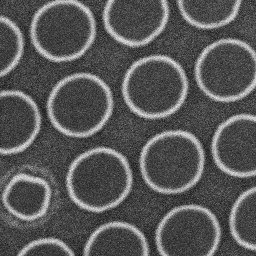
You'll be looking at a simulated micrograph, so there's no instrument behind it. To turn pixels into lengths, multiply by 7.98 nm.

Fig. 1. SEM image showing raised bodies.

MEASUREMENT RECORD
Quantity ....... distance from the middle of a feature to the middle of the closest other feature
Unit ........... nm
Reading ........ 599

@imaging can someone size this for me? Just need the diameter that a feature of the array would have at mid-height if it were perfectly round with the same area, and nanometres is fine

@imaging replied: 486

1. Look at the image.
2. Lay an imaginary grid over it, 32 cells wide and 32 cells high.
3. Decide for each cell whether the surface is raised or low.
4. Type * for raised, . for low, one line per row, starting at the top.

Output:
......****....*******.********..
.....******..********..******...
*...********.********...*****...
**..********.*******............
***.********..*****.............
***.*******.....**.........***..
***..*****................******
**................***....*******
*................*****...*******
.........**.....*******..*******
.......******...*******..*******
.......*******..*******...*****.
****..********..*******.........
****..********...*****..........
*****.*******.....**............
*****..******...............****
*****...****...............*****
****...............*****...*****
***...............*******..*****
..........*****...*******..*****
.........*******..*******..*****
.........*******..*******....***
..***....*******..******........
.*****...*******...****.........
.*****...******...............**
.*****....****................**
..***.................****...***
.....................******..***
.............****...*******..***
............******..*******..***
....****...*******..*******...**
...******..*******..*******.....